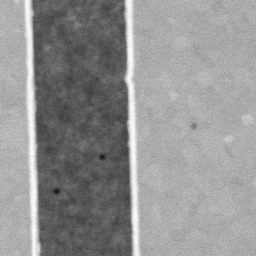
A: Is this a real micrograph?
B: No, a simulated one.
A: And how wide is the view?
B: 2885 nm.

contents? one or a few lines or trenches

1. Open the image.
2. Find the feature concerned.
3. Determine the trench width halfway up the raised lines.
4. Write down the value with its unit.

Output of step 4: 1.14 µm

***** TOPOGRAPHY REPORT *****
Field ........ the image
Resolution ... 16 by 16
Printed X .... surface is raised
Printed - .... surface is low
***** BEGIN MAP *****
XX------XXXXXXXX
XX------XXXXXXXX
XX------XXXXXXXX
XX------XXXXXXXX
XX------XXXXXXXX
XX------XXXXXXXX
XX------XXXXXXXX
XX------XXXXXXXX
XX------XXXXXXXX
XX------XXXXXXXX
XX------XXXXXXXX
XX------XXXXXXXX
XX------XXXXXXXX
XX------XXXXXXXX
XX------XXXXXXXX
XX-------XXXXXXX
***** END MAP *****